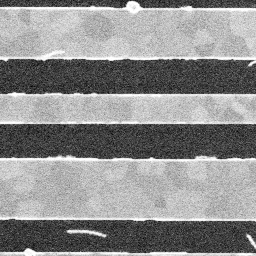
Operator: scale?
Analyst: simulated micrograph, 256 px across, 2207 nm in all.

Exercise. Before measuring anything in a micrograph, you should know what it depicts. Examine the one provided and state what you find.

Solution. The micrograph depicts lines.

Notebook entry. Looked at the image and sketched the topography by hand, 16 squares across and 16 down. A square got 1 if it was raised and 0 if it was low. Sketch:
0000000010000000
1111111111111111
1111111111111111
1111111111111111
0000000000000000
0000000000000000
1111111111111111
1111111111111111
0000000000000000
0000000000000000
1111111111111111
1111111111111111
1111111111111111
1111111111111111
0000000000000000
0000000000000000